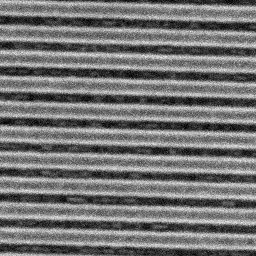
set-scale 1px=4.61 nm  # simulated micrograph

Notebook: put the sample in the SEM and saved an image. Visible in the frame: parallel lines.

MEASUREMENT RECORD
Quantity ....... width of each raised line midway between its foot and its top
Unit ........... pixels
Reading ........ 15.1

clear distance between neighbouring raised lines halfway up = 47.8 nm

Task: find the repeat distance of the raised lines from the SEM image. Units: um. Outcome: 0.117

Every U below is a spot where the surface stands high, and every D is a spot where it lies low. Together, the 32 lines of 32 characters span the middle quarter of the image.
UUUUUUUUUUUUUUUUUUUUUUUUUUUUUUUU
DDDDDDDDDDDDDDDDDDDDDDDDDDDUUUUU
DDDDDDDDDDDDDDDDDDDDDDDDDDDDDDDD
DUUDDDDDDDDDDDDDDDDDDDDDDDDDDDDD
UUUUUUUUUUUUUUUUUUUUUUUUUUUUUUUU
UUUUUUUUUUUUUUUUUUUUUUUUUUUUUUUU
UUUUUUUUUUUUUUUUUUUUUUUUUUUUUUUU
DDDDDDDDDDDDDDUUUUUUUUUUUUUUUUUU
DDDDDDDDDDDDDDDDDDDDDDDDDDDDDDDD
DDDDDDDDDDDDDDDDDDDDDDDDDDDDDDDD
UUUUUUUUUUUUUUUUUUUUUDDDDDDDDDDD
UUUUUUUUUUUUUUUUUUUUUUUUUUUUUUUU
UUUUUUUUUUUUUUUUUUUUUUUUUUUUUUUU
DUUUUUUUUUUUUUUUUUUUUUUUUUUUUUUU
DDDDDDDDDDDDDDDDDDDDDDDDDDDDDDDD
DDDDDDDDDDDDDDDDDDDDDDDDDDDDDDDD
UUUUUUUUDDDDDDDDDDDDDDDDDDDDDDDD
UUUUUUUUUUUUUUUUUUUUUUUUUUUUUUUU
UUUUUUUUUUUUUUUUUUUUUUUUUUUUUUUU
UUUUUUUUUUUUUUUUUUUUUUUUUUUUUUUU
DDDDDDDDDDDDDDDDDDDDDDDDDUUUUUUU
DDDDDDDDDDDDDDDDDDDDDDDDDDDDDDDD
UUUDDDDDDDDDDDDDDDDDDDDDDDDDDDDD
UUUUUUUUUUUUUUUUUUUUUUUUUUUUUUUU
UUUUUUUUUUUUUUUUUUUUUUUUUUUUUUUU
UUUUUUUUUUUUUUUUUUUUUUUUUUUUUUUU
DDDDDDDDDDDDDDDDDDDDUUUUUUUUUUUU
DDDDDDDDDDDDDDDDDDDDDDDDDDDDDDDD
DDDDDDDDDDDDDDDDDDDDDDDDDDDDDDDD
UUUUUUUUUUUUUUUUUUUUUUUUUUUDDDDD
UUUUUUUUUUUUUUUUUUUUUUUUUUUUUUUU
UUUUUUUUUUUUUUUUUUUUUUUUUUUUUUUU